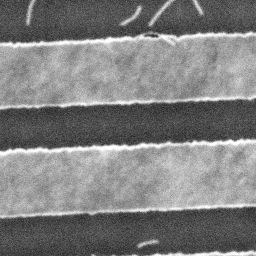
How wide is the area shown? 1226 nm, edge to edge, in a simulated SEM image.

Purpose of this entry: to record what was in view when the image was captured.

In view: lines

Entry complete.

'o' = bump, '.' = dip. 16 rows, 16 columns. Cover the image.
................
................
......oooooooooo
oooooooooooooooo
oooooooooooooooo
oooooooooooooooo
oooooo..........
................
................
oooooooooooooooo
oooooooooooooooo
oooooooooooooooo
oooooooooooooooo
oo..............
................
................